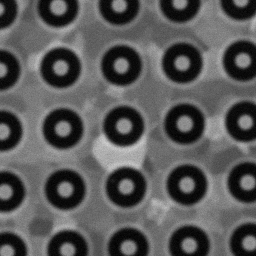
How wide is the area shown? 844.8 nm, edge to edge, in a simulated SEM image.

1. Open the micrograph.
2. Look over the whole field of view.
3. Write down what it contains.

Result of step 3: an array of small figures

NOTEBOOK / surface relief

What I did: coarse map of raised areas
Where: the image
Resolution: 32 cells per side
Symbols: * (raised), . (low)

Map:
..***.....**......**.....**.....
..***.....**.....***.....***....
..***.....***....****...*****..*
.******.************************
********************************
**************..*****...*****...
.*****...****....***.....***....
..***.....***.....**.....***....
...**.....**......**.....***....
...**.....***.....***....***....
..****...*****...*****..********
.*******************************
******************************.*
*******..*****...****....****...
..****....***.....***.....**....
...**......**.....**......**....
...**......**.....***.....**....
...**.....***.....***....****...
..*****..******.****************
********************************
**********************..******..
..*****...****....***.....***...
...***.....**.....***.....**....
...**......**.....***.....**....
...***.....**.....***.....***...
...***....****....****...*****..
..******************************
********************************
***************..*****...****...
...***....****....***.....***...
...***.....**......**.....***...
....**.....**......**.....***...